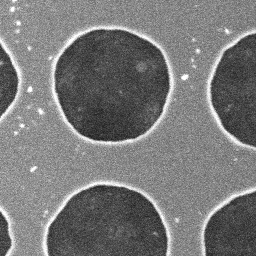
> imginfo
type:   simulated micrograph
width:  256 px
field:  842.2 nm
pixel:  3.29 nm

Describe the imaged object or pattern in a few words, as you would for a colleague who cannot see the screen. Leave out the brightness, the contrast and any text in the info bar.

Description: holes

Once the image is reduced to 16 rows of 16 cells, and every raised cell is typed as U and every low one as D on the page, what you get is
UUUUUUUUUUUUUUUU
UUUUUUUUUUUUUUUU
UUUUUDDDDUUUUUUD
DUUUDDDDDDUUUUDD
DUUDDDDDDDDUUDDD
DUUDDDDDDDDUUDDD
DUUUDDDDDDUUUDDD
UUUUDDDDDDUUUUDD
UUUUUDDDDUUUUUDD
UUUUUUUUUUUUUUUU
UUUUUUUUUUUUUUUU
UUUUUUUUUUUUUUUU
UUUUDDDDDUUUUUDD
UUUUDDDDDDUUUDDD
DUUDDDDDDDUUUDDD
DUUDDDDDDDUUUDDD